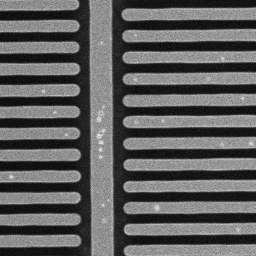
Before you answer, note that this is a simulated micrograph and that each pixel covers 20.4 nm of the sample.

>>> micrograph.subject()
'groups of lines, slits or small figures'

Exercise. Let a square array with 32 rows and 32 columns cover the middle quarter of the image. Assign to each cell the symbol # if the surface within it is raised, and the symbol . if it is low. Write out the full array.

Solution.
####...#####....................
####...#####....................
###....#####.....####.....######
.......#####...#################
.......#####...#################
####...#####....................
####...#####....................
###....#####....................
.......#####...#################
.......#####...#################
.......#####....########........
####...#####....................
####...#####....................
.......#####...#################
.......#####...#################
.......#####...#################
####...#####....................
####...#####....................
###....#####...............#####
.......#####...#################
.......#####...#################
###....#####....................
####...#####....................
####...#####....................
.......#####...#################
.......#####...#################
.......#####..........#######...
####...#####....................
####...#####....................
.......#####....################
.......#####...#################
.......#####...#################